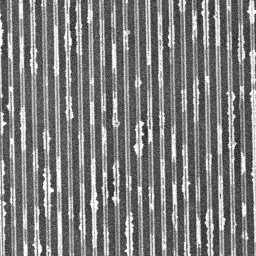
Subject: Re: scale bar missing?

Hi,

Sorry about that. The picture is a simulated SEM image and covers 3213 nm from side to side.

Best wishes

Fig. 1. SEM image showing parallel lines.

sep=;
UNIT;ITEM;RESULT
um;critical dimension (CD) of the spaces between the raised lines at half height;0.0973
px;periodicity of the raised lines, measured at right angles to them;11.5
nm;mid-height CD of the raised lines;43.9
